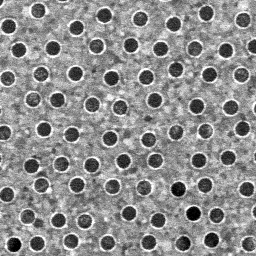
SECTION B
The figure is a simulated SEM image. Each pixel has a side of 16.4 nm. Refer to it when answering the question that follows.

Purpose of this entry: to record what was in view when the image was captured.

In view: a regular array of holes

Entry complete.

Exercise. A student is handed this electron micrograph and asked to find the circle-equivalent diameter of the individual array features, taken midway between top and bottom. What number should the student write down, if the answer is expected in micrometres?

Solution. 0.263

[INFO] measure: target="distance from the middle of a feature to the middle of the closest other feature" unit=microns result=0.434